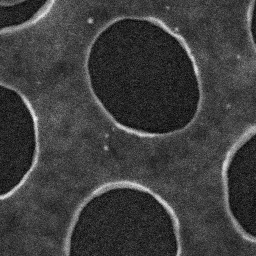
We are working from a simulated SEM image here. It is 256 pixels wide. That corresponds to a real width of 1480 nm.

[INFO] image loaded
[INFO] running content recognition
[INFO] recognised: holes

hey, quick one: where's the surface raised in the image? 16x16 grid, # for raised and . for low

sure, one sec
...#############
.######...######
######.....#####
######......####
######......####
######......####
..####......####
..#####.....####
..##############
..#############.
..############..
.#############..
######....####..
#####......####.
####.......####.
####.......#####